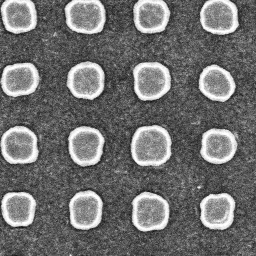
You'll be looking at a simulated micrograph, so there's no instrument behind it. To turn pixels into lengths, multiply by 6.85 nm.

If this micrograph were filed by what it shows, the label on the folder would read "a regular array of raised bodies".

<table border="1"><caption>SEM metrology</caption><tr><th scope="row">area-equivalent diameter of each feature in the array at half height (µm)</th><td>0.236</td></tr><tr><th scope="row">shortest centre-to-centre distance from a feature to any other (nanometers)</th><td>443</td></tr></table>